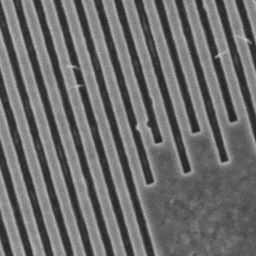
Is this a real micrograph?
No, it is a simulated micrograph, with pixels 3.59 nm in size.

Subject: parallel lines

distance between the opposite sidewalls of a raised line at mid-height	40.5	nm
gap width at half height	0.031	microns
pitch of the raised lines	69.8	nanometers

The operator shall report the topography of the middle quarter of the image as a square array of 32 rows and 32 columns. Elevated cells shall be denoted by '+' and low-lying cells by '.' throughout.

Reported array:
++..+++..+++..+++..+++..+++..+++
++..+++...++...++...++...+++..++
+++..+++..+++..+++..+++..+++..++
+++..+++..+++..+++..+++..+++..++
+++..+++..+++..+++..+++..+++...+
++++.+++..++++..++...+++..+++..+
.+++..+++..+++..+++..+++..+++..+
.+++..+++..+++..+++..+++..+++...
.+++..+++..+++...++...++...++...
..+++..+++..+++..+++..+++..+++..
..+++..+++..+++..+++..+++..+++..
..+++..+++..+++..+++..+++...++..
..+++..+++...+++..+++..+++..+++.
+..++...+++..+++..+++..+++..+++.
+..+++..+++..+++..+++..+++..+++.
+..+++..+++...++..+++...+++..+++
++..+++..+++..+++.++++..+++..+++
++..+++..+++..+++..+++..+++..+++
++..+++..+++..+++..+++..+++..+++
++...++...++...+++..+++..+++..++
+++..+++..+++..+++..++++++++..++
+++..+++..+++..+++..++++++++..++
+++..+++..+++...++...++++++++..+
.+++..+++..+++..+++..++++++++..+
.+++..+++..+++..+++..++++++++..+
.+++..+++..+++..+++..++++++++..+
..++...++...++...++...++++++++..
..+++..+++..+++..+++..++++++++++
..+++..+++..+++..+++..++++++++++
..+++..+++..+++...++..++++++++++
+..+++..+++..+++..++++++++++++++
+..+++..+++..+++..++++++++++++++